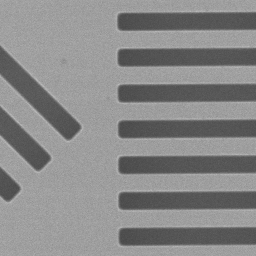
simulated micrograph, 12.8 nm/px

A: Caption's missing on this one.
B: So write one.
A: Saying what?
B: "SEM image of groups of lines, slits or small figures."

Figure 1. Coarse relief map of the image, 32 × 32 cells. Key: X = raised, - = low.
XXXXXXXXXXXXXXXXXXXXXXXXXXXXXXXX
XXXXXXXXXXXXXXXXXXXXXXXXXXXXXXXX
XXXXXXXXXXXXXXX-----------------
XXXXXXXXXXXXXXX-----------------
XXXXXXXXXXXXXXXXXXXXXXXXXXXXXXXX
XXXXXXXXXXXXXXXXXXXXXXXXXXXXXXXX
-XXXXXXXXXXXXXX-----------------
--XXXXXXXXXXXXX-----------------
---XXXXXXXXXXXXXXXXXXXXXXXXXXXXX
----XXXXXXXXXXXXXXXXXXXXXXXXXXXX
X----XXXXXXXXXXXXXXXXXXXXXX-----
XX----XXXXXXXXX-----------------
XXX----XXXXXXXX-----------------
XXXX----XXXXXXXXXXXXXXXXXXXXXXXX
-XXXX----XXXXXXXXXXXXXXXXXXXXXXX
--XXXX----XXXXX-----------------
---XXXX---XXXXX-----------------
X---XXXXXXXXXXXXXXXXXXXXXXXXXXXX
XX---XXXXXXXXXXXXXXXXXXXXXXXXXXX
XXX---XXXXXXXXXXXXXXX-----------
XXXX--XXXXXXXXX-----------------
-XXXXXXXXXXXXXX-----------------
--XXXXXXXXXXXXXXXXXXXXXXXXXXXXXX
--XXXXXXXXXXXXXXXXXXXXXXXXXXXXXX
--XXXXXXXXXXXXX-----------------
XXXXXXXXXXXXXXX-----------------
XXXXXXXXXXXXXXXXXXXXXXXXXXXXXXXX
XXXXXXXXXXXXXXXXXXXXXXXXXXXXXXXX
XXXXXXXXXXXXXXXX----------------
XXXXXXXXXXXXXXX-----------------
XXXXXXXXXXXXXXX-----------------
XXXXXXXXXXXXXXXXXXXXXXXXXXXXXXXX